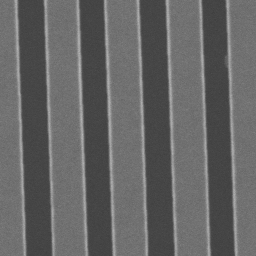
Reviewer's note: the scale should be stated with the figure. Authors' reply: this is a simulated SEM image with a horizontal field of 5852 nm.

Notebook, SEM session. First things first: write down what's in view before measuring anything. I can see lines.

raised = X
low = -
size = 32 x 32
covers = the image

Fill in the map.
XX----XXXX---XXXX----XXXX---XXXX
XX----XXXX---XXXX----XXXX---XXXX
XX----XXXX---XXXX----XXXX---XXXX
XX----XXXX---XXXX----XXXX---XXXX
XX----XXXX---XXXX----XXXX----XXX
XX----XXXX---XXXXX---XXXX----XXX
XX----XXXX---XXXXX---XXXX----XXX
XX----XXXX---XXXXX---XXXX----XXX
XX----XXXX---XXXXX---XXXX----XXX
XX----XXXX---XXXXX---XXXX----XXX
XX----XXXX---XXXXX---XXXXX---XXX
XX----XXXX---XXXXX---XXXXX---XXX
XXX---XXXX---XXXXX---XXXXX---XXX
XXX---XXXX---XXXXX---XXXXX---XXX
XXX---XXXX----XXXX---XXXXX---XXX
XXX---XXXX----XXXX---XXXXX---XXX
XXX---XXXX----XXXX---XXXXX---XXX
XXX---XXXX----XXXX---XXXXX---XXX
XXX---XXXX----XXXX---XXXXX---XXX
XXX---XXXX----XXXX---XXXXX---XXX
XXX---XXXXX---XXXX---XXXXX---XXX
XXX---XXXXX---XXXX----XXXX---XXX
XXX---XXXXX---XXXX----XXXX---XXX
XXX---XXXXX---XXXX----XXXX---XXX
XXX---XXXXX---XXXX----XXXX---XXX
XXX---XXXXX---XXXX----XXXX---XXX
XXX---XXXXX---XXXX----XXXX---XXX
XXX---XXXXX---XXXX----XXXX---XXX
XXX---XXXXX---XXXX----XXXX---XXX
XXX----XXXX---XXXX----XXXX---XXX
XXX----XXXX---XXXX----XXXX---XXX
XXX----XXXX---XXXX----XXXX---XXX